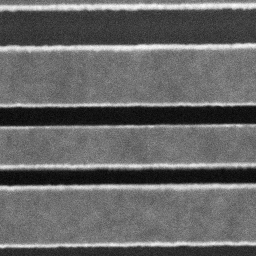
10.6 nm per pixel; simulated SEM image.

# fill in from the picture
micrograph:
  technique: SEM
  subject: lines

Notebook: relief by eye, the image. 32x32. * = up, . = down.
********************************
................................
................................
................................
................................
.............................***
********************************
********************************
********************************
********************************
********************************
********************************
********************************
................................
................................
................................
********************************
********************************
********************************
********************************
********************************
................................
................................
********************************
********************************
********************************
********************************
********************************
********************************
********************************
********************************
................................